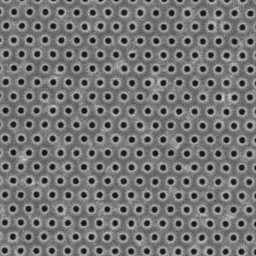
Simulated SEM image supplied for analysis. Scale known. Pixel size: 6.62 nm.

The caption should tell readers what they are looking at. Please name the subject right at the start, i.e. a regular array of holes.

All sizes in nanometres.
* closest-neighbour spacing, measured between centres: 103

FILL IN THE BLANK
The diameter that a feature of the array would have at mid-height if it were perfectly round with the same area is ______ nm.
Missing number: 43.6